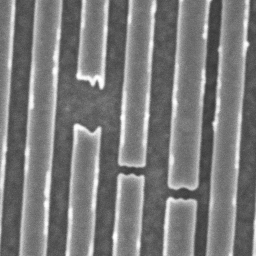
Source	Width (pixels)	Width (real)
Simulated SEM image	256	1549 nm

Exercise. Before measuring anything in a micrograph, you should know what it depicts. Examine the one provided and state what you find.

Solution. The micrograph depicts parallel lines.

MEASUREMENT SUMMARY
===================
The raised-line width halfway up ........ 161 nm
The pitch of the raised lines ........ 282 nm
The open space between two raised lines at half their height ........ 122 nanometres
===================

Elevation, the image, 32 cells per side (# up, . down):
##..####..###...###...####..###.
##..####..###...###...####..###.
##..####..###...###...####..###.
##..####..###...###...####..###.
##..####..###...###...####..###.
##..###...###...###...####.####.
#...###...###...###...####.####.
#...###...###...###...####.####.
#...###...###...###...####.####.
#...###...###...###...####.####.
#...###.....#...###...####.###..
#...###........####...####.###..
#...###........####...###..###..
#...###........####...###..###..
#...###........####...###..###..
#..####........###...####..###..
#..####..##....###...####..###..
#..####..###...###...####..###..
#..####..###...###...####..###..
#..###...###...###...####..###..
#..###...###...###...####..###..
#..###...###.........####.####..
...###...###...###...####.####..
...###...###...###.....#..####..
...###...###...###........####..
...###...###...###...####.###...
...###...###..####...###..###...
...###...###..####...###..###...
...###...###..####...###..###...
...###..####..####...###..###...
...###..####..###....###..###...
...###..####..###...####..###...